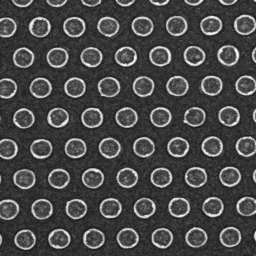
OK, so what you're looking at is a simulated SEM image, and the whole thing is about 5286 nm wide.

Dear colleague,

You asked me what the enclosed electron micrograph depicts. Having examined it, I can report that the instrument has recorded a regular array of raised bodies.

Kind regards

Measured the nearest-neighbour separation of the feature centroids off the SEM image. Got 0.703 micrometres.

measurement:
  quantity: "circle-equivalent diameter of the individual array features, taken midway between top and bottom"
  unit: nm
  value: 414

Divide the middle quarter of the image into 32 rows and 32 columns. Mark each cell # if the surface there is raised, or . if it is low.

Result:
......##.......#................
................................
................................
...................##......##...
.####....####.....####....#####.
#####....#####....####....#####.
#####....#####....####....#####.
.####....####.....####.....###..
................................
................................
................................
......###.....###......###.....#
#....####....#####....#####...##
#....#####...#####....#####...##
#....####....#####....####....##
......##......###......##.......
................................
................................
................................
.####....####.....####....#####.
#####....#####....####....#####.
#####....#####....####....#####.
.####.....###.....####.....###..
................................
................................
................................
......##......###......###.....#
#....####.....####....#####....#
#....#####...#####....#####....#
#....#####....####....####.....#
......###......##......##.......
................................